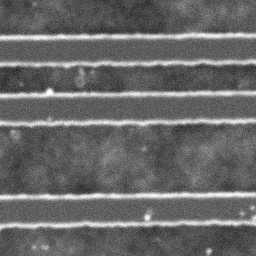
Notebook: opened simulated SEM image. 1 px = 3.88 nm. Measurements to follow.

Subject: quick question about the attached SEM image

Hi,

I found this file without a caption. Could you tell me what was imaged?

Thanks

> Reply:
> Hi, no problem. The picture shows lines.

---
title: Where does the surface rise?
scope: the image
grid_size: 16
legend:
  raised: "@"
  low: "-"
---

----------------
----------------
@@@@@@@@@@@@@@@@
@@@@@@@@@@@@@@@@
----------------
----------------
@@@@@@@@@@@@@@@@
@@@@@@@@@@@@@@@@
----------------
----------------
----------------
----------------
@@@@@@@@@@@@@@@@
@@@@@@@@@@@@@@@@
----------------
----------------